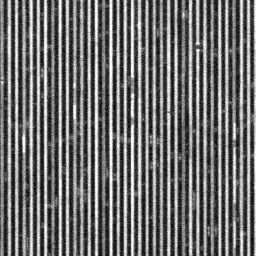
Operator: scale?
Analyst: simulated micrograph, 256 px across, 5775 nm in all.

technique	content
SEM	parallel lines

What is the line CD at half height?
45.1 nanometres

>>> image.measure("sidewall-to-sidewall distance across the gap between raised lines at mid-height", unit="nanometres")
135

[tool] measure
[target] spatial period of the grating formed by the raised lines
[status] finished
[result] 0.164 micrometres